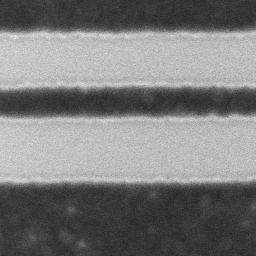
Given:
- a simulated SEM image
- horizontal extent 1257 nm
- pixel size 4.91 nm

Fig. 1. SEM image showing one or a few lines or trenches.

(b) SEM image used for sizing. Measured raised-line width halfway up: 178 nm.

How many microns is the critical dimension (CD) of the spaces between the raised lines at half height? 0.266